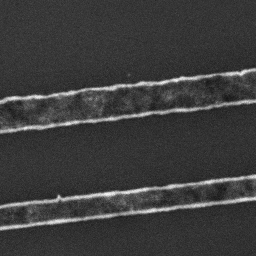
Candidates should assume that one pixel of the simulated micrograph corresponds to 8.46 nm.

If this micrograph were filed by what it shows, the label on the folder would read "one or a few lines or trenches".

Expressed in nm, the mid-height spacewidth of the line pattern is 625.